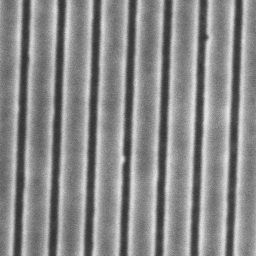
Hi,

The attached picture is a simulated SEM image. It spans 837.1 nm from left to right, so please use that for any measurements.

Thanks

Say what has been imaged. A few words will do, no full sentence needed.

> parallel lines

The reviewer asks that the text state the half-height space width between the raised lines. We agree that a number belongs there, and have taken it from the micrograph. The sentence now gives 0.0312 µm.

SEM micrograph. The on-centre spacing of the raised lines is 0.116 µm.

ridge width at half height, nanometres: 82.1